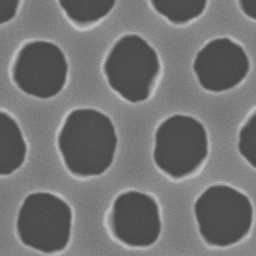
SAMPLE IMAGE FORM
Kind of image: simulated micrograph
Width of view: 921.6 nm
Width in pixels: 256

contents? a regular array of holes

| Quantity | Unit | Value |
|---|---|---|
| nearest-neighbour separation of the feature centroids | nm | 312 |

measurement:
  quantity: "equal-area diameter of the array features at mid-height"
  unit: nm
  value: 211